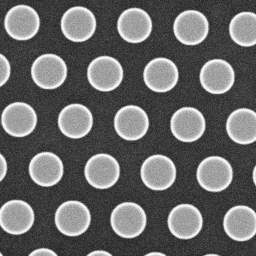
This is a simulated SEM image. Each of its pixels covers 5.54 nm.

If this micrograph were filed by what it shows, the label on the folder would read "an array of small figures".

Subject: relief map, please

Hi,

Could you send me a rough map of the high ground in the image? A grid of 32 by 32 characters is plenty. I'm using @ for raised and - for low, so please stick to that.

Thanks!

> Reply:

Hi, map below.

--------------------------------
-@@@----@@@-----@@-----@@-------
-@@@@---@@@@---@@@@---@@@@---@@@
-@@@@---@@@@---@@@@---@@@@---@@@
-@@@----@@@----@@@----@@@@---@@@
-----------------------@@-----@@
--------------------------------
@----@@@----@@-----@@-----------
@---@@@@---@@@@---@@@@---@@@@---
@---@@@@---@@@@---@@@@---@@@@---
-----@@@---@@@@---@@@@---@@@@---
--------------------------@@----
--------------------------------
-@@@----@@@----@@---------------
@@@@@--@@@@----@@@----@@@----@@@
@@@@---@@@@---@@@@@--@@@@@--@@@@
-@@@----@@@----@@@----@@@---@@@@
-----------------------@-----@@@
--------------------------------
-----@@-----@@-----@------------
@---@@@@---@@@@---@@@@---@@@@---
@---@@@@---@@@@---@@@@---@@@@---
----@@@----@@@@---@@@@---@@@@---
------------@------@@-----@@----
--------------------------------
-@@-----@@-----@@---------------
@@@@---@@@@---@@@@---@@@@----@@@
@@@@---@@@@---@@@@---@@@@---@@@@
@@@@---@@@@---@@@@---@@@@---@@@@
---------------@@-----@@-----@@@
--------------------------------
----@@@-----@-------------------